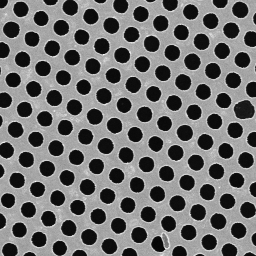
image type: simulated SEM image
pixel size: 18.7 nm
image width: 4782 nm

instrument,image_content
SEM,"a regular array of holes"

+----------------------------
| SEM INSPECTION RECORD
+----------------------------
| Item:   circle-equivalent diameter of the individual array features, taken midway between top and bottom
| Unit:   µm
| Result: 0.292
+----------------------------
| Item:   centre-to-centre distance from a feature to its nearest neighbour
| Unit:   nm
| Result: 412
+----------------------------